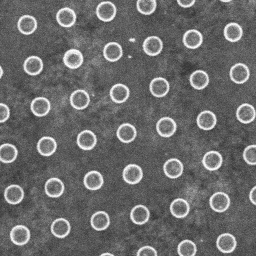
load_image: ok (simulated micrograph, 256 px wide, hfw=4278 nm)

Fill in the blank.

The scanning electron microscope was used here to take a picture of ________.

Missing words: a regular array of raised bodies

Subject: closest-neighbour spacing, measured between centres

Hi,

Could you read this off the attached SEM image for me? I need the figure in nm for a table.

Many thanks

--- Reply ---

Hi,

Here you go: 672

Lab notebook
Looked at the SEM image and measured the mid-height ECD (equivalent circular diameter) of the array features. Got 301 nanometres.